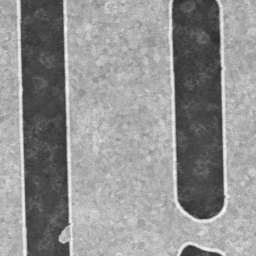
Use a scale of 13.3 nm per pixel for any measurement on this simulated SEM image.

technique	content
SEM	one or a few lines or trenches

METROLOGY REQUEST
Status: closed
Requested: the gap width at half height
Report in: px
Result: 47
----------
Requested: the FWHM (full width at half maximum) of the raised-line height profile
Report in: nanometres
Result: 1400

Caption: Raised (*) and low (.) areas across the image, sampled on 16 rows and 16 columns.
*...*******...**
*...*******...**
*...*******...**
*...*******...**
*...*******...**
*...*******...**
*...*******...**
*...*******...**
*...*******...**
*...*******...**
*...*******...**
*...*******...**
*...*******...**
*...********..**
*...************
**..*******..***